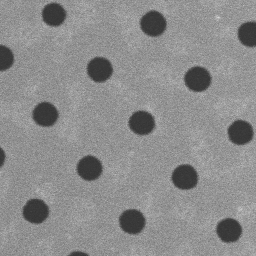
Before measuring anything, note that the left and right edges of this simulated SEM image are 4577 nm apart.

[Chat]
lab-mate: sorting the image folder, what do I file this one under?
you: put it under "a regular array of holes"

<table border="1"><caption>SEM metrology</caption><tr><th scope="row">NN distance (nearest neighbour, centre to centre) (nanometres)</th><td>1230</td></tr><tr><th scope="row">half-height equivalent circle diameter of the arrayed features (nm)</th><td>467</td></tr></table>